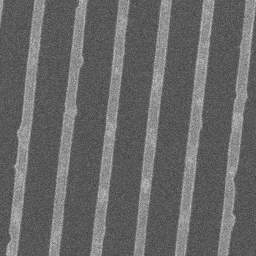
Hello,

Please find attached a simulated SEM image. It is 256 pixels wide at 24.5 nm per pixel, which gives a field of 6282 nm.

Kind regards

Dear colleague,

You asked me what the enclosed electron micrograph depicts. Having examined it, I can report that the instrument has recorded parallel lines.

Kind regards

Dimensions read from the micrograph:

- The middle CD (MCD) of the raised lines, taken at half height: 0.232 µm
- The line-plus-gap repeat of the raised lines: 1030 nanometers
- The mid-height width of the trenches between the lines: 0.811 microns